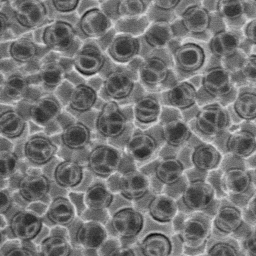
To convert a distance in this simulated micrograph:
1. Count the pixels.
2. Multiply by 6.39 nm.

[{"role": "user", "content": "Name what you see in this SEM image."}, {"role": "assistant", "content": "a regular array of raised bodies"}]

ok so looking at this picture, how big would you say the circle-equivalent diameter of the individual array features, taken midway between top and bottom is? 153 nm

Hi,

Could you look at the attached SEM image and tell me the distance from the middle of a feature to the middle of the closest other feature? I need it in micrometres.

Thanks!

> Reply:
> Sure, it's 0.238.